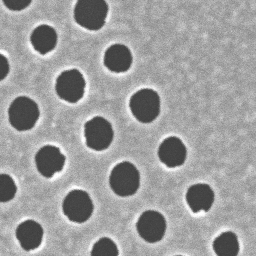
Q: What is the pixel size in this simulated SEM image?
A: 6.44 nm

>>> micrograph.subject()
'a regular array of holes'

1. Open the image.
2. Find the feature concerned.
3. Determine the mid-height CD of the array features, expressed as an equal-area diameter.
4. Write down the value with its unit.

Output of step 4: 203 nanometers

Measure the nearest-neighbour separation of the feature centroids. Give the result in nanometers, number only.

347